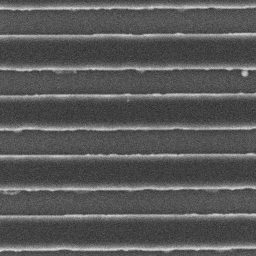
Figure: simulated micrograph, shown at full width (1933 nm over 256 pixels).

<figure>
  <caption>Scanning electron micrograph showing lines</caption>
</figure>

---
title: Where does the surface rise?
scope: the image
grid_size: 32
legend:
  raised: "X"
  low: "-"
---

XXXXXXXXXXXXXXXXXXXXXXXXXXXXXXXX
--------------------------------
--------------------------------
--------------------------------
XXXXXXXXXXXXXXXXXXXXXXXXXXXXXXXX
XXXXXXXXXXXXXXXXXXXXXXXXXXXXXXXX
XXXXXXXXXXXXXXXXXXXXXXXXXXXXXXXX
XXXXXXXXXXXXXXXXXXXXXXXXXXXXXXXX
XXXXXXXXXXXXXXXXXXXXXXXXXXXXXXXX
--------------------------------
--------------------------------
--------------------------------
XXXXXXXXXXXXXXXXXXXXXXXXXXXXXXXX
XXXXXXXXXXXXXXXXXXXXXXXXXXXXXXXX
XXXXXXXXXXXXXXXXXXXXXXXXXXXXXXXX
XXXXXXXXXXXXXXXXXXXXXXXXXXXXXXXX
--------------------------------
--------------------------------
--------------------------------
XXXXXXXXXXXXXXXXXXXXXXXXXXXXXXXX
XXXXXXXXXXXXXXXXXXXXXXXXXXXXXXXX
XXXXXXXXXXXXXXXXXXXXXXXXXXXXXXXX
XXXXXXXXXXXXXXXXXXXXXXXXXXXXXXXX
XXXXXXXXXXXXXXXXXXXXXXXXXXXXXXXX
--------------------------------
--------------------------------
--------------------------------
XXXXXXXXXXXXXXXXXXXXXXXXXXXXXXXX
XXXXXXXXXXXXXXXXXXXXXXXXXXXXXXXX
XXXXXXXXXXXXXXXXXXXXXXXXXXXXXXXX
XXXXXXXXXXXXXXXXXXXXXXXXXXXXXXXX
--------------------------------